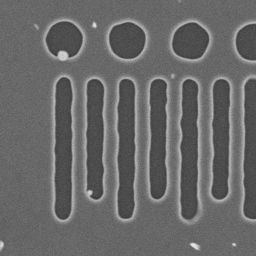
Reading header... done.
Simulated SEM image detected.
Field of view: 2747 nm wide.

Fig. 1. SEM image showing groups of lines, slits or small figures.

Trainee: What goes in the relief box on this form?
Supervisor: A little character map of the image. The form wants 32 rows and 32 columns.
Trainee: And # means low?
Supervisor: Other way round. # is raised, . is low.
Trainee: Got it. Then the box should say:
################################
################################
################################
######....####....####...#####..
######....####....####....####..
######....####....###.....###...
######....####....####....####..
###############################.
################################
################################
#######..##..##..##..##..##..##.
#######..##..##..##..##..##..#..
#######..##..##..##..##..##..#..
#######..##..##..##..##..##..#..
#######..##..##..##..##..##..#..
#######..##..##..##..##..#...#..
#######..##..##..##..##..##..##.
#######..##..##..##..##..#...#..
#######..##..##..##..##..##..#..
#######..##..##..##..##..##..#..
#######..##..##..##..##..##..#..
#######..##..##..##..##..##..#..
#######..##..##..##..##..##..#..
#######..##..##..##..##..#...#..
#######..##..##..##.###..##.###.
#######..######..######..#####..
#######..######..######..#####..
#######################.########
################################
################################
################################
################################